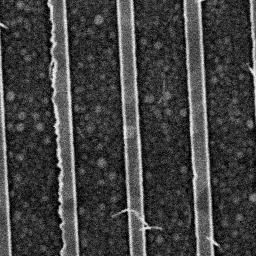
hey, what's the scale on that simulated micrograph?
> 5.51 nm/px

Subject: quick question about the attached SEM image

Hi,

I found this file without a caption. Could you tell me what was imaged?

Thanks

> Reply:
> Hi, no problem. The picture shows one or a few lines or trenches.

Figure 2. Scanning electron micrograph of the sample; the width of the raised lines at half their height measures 79.7 nanometres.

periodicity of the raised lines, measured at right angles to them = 0.37 um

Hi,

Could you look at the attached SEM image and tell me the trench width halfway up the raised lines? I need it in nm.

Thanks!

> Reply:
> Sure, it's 291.